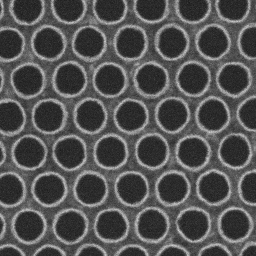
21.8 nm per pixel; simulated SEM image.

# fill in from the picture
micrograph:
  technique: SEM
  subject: a regular array of raised bodies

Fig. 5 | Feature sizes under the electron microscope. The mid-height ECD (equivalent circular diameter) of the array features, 732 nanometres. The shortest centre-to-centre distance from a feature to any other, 887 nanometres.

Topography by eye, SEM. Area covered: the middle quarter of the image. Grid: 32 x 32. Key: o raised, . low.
oooo.....ooooo.....ooooo......oo
ooooo...ooooooo...ooooooo....ooo
ooooo...ooooooo...oooooooo..oooo
ooooo..oooooooo...oooooooo..oooo
oooooo.oooooooo...oooooooo..oooo
ooooo...ooooooo...oooooooo...ooo
ooooo...ooooooo....oooooo....ooo
oooo.....ooooo......oooo......oo
................................
....ooooo......oooo.....oooooo..
...ooooooo....oooooo....ooooooo.
...ooooooo...oooooooo..oooooooo.
o..ooooooo...oooooooo..oooooooo.
...oooooooo..oooooooo..oooooooo.
...ooooooo...oooooooo..oooooooo.
...ooooooo...ooooooo....oooooo..
.....oooo.....ooooo......oooo...
......................o.........
oooo.....ooooo......ooooo.....oo
ooooo...ooooooo....ooooooo...ooo
ooooo...ooooooo...oooooooo..oooo
ooooo...oooooooo..oooooooo..oooo
oooooo..oooooooo..oooooooo..oooo
ooooo...oooooooo..oooooooo..oooo
ooooo...ooooooo....oooooo....ooo
oooo.....ooooo......oooo......oo
................................
.....ooo.......oooo......ooooo..
....oooooo....oooooo....ooooooo.
...ooooooo...oooooooo..oooooooo.
...oooooooo..oooooooo..oooooooo.
...oooooooo..oooooooo..oooooooo.